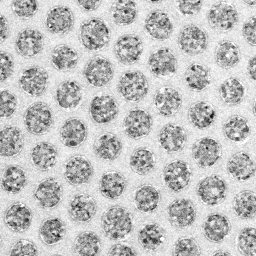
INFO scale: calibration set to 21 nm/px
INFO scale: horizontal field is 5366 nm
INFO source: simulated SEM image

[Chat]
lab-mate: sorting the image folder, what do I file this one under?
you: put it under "a regular array of raised bodies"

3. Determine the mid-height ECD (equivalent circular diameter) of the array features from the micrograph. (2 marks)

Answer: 557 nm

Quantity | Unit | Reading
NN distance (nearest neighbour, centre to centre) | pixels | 37.2